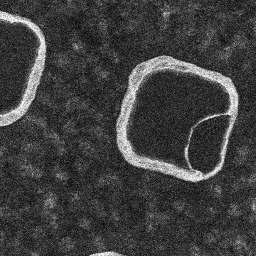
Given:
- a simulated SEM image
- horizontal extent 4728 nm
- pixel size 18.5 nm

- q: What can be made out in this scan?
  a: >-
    raised bodies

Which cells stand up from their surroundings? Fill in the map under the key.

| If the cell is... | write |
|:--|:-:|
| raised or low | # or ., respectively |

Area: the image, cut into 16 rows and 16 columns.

................
##..............
###.............
###.............
##.......####...
##......######..
##......#######.
........#####...
........####....
........####....
..........##....
................
................
................
................
................